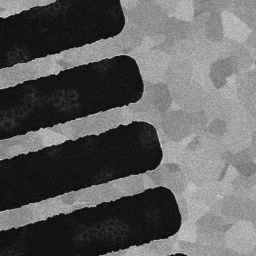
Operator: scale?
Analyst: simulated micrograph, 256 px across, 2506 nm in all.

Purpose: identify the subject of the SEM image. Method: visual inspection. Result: one or a few lines or trenches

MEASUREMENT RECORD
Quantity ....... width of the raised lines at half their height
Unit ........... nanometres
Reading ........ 177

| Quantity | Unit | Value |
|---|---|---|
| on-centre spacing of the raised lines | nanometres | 672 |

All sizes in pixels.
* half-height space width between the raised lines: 50.4